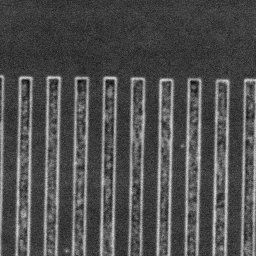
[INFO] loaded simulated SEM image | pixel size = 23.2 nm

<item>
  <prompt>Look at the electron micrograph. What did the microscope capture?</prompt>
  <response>parallel lines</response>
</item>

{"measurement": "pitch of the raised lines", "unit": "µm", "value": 0.654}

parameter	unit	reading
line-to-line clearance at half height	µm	0.244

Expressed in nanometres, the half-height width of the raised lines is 398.